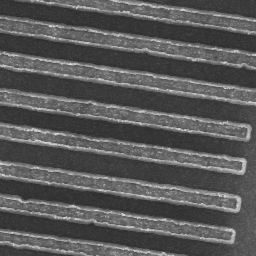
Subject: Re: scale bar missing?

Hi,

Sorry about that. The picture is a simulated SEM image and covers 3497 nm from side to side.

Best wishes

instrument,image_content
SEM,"parallel lines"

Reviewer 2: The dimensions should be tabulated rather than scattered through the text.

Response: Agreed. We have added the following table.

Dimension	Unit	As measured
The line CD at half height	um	0.211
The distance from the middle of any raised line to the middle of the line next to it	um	0.48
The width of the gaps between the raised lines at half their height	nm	265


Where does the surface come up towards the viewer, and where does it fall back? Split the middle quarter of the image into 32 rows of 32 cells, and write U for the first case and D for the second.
UUUUUUUUDDDDDDDDDDDDDDDDDDDDDDDD
UUUUUUUUUUUUUUDDDDDDDDDDDDDDDDDD
UUUUUUUUUUUUUUUUUUUUUUDDDDDDDDDD
DDUUUUUUUUUUUUUUUUUUUUUUUUUUDDDD
DDDDDDDDDUUUUUUUUUUUUUUUUUUUUUUU
DDDDDDDDDDDDDDDDUUUUUUUUUUUUUUUU
DDDDDDDDDDDDDDDDDDDDDDDUUUUUUUUU
DDDDDDDDDDDDDDDDDDDDDDDDDDDDDDUU
DDDDDDDDDDDDDDDDDDDDDDDDDDDDDDDD
UUUUUUUUDDDDDDDDDDDDDDDDDDDDDDDD
UUUUUUUUUUUUUDDDDDDDDDDDDDDDDDDD
UUUUUUUUUUUUUUUUUUUDDDDDDDDDDDDD
UUUUUUUUUUUUUUUUUUUUUUUUUUDDDDDD
DDDDDDDDDUUUUUUUUUUUUUUUUUUUUUUU
DDDDDDDDDDDDDDUUUUUUUUUUUUUUUUUU
DDDDDDDDDDDDDDDDDDDDDUUUUUUUUUUU
DDDDDDDDDDDDDDDDDDDDDDDDDDDUUUUU
UUDDDDDDDDDDDDDDDDDDDDDDDDDDDDDD
UUUUUUUDDDDDDDDDDDDDDDDDDDDDDDDD
UUUUUUUUUUUUUUUDDDDDDDDDDDDDDDDD
UUUUUUUUUUUUUUUUUUUUUUDDDDDDDDDD
DDDDDUUUUUUUUUUUUUUUUUUUUUUUUDDD
DDDDDDDDDDDDUUUUUUUUUUUUUUUUUUUU
DDDDDDDDDDDDDDDDDUUUUUUUUUUUUUUU
DDDDDDDDDDDDDDDDDDDDDDDUUUUUUUUU
DDDDDDDDDDDDDDDDDDDDDDDDDDDDDDDD
DDDDDDDDDDDDDDDDDDDDDDDDDDDDDDDD
UUUUUDDDDDDDDDDDDDDDDDDDDDDDDDDD
UUUUUUUUUUUDDDDDDDDDDDDDDDDDDDDD
UUUUUUUUUUUUUUUUUUUDDDDDDDDDDDDD
UUUUUUUUUUUUUUUUUUUUUUUUUDDDDDDD
DDDDDDDUUUUUUUUUUUUUUUUUUUUUUUUU